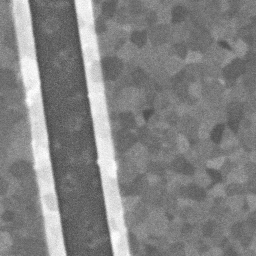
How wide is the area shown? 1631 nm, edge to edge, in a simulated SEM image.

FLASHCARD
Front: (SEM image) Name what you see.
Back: one or a few lines or trenches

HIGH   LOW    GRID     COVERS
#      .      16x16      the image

#....###########
#....###########
##....##########
##....##########
##....##########
##....##########
##....##########
##....##########
##....##########
###....#########
###....#########
###....#########
###....#########
###....#########
###....#########
####....########